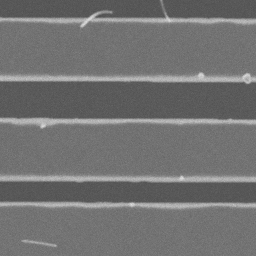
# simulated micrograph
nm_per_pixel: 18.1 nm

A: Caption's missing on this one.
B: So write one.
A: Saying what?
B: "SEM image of lines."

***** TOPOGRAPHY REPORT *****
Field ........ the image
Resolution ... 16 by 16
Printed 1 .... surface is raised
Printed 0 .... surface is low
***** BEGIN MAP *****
0000000000000000
1111111111111111
1111111111111111
1111111111111111
1111111111111111
0000000000000000
0000000000000000
1000100010000000
1111111111111111
1111111111111111
1111111111111111
0000000000000000
0000000000000000
1111111111111111
1111111111111111
1111111111111111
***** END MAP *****